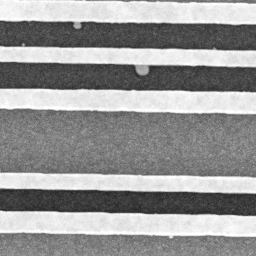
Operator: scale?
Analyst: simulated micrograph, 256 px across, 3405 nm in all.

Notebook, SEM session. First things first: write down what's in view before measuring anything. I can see lines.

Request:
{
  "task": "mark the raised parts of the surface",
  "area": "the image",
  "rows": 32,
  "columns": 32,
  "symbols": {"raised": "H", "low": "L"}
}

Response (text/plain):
HHHHHHHHHHHHHHHHHHHHHHHHHHHHHHHL
HHHHHHHHHHHHHHHHHHHHHHHHHHHHHHHH
HHHHHHHHHHHHHHHHHHHHHHHHHHHHHHHH
LLLLLLLLLLLLLLLLLLLLLLLLLLLLLLLL
LLLLLLLLLLLLLLLLLLLLLLLLLLLLLLLL
LLLLLLLLLLLLLLLLLLLLLLLLLLLLLLLL
HHHHHHHHHHHHHHHHHHHHHHHHHHHHHHHH
HHHHHHHHHHHHHHHHHHHHHHHHHHHHHHHH
LLLLLLLLLLLLLLLLLLLLLLLLLLLLLLLL
LLLLLLLLLLLLLLLLLLLLLLLLLLLLLLLL
LLLLLLLLLLLLLLLLLLLLLLLLLLLLLLLL
HHHHHHHHHHHHHHHHHHHHHHHHLLLLLLLL
HHHHHHHHHHHHHHHHHHHHHHHHHHHHHHHH
LHLLHHHHHHHHHHHHHHHHHHHHHHHHHHHH
LLLLLLLLLLLLLLLLLLLLLLLLLLLLLLLL
LLLLLLLLLLLLLLLLLLLLLLLLLLLLLLLL
LLLLLLLLLLLLLLLLLLLLLLLLLLLLLLLL
LLLLLLLLLLLLLLLLLLLLLLLLLLLLLLLL
LLLLLLLLLLLLLLLLLLLLLLLLLLLLLLLL
LLLLLLLLLLLLLLLLLLLLLLLLLLLLLLLL
LLLLLLLLLLLLLLLLLLLLLLLLLLLLLLLL
LLLLLLLLLLLLLLLLLLLLLLLLLLLLLLLL
HHHHHHHHHHHHHHHHHHHHHHHHHHHHHHHH
HHHHHHHHHHHHHHHHHHHHHHHHHHHHHHHH
LLLLLLLLLLLLLLLLLLLLLLLLLLLLLLLL
LLLLLLLLLLLLLLLLLLLLLLLLLLLLLLLL
HLLLLLLLLLLLLLLLLLLLLLLLLLLLLLLL
HHHHHHHHHHHHHHHHHHHHHHHHHHHHHHHH
HHHHHHHHHHHHHHHHHHHHHHHHHHHHHHHH
LLLLLLLLLLLLLLLLLLLLLLLLLLLLLLLL
LLLLLLLLLLLLLLLLLLLLLLLLLLLLLLLL
LLLLLLLLLLLLLLLLLLLLLLLLLLLLLLLL